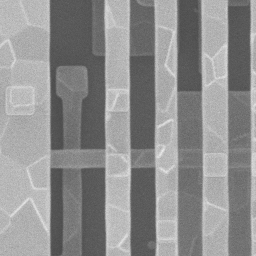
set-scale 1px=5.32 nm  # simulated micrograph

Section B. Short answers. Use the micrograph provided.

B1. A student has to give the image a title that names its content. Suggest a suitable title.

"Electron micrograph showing wiring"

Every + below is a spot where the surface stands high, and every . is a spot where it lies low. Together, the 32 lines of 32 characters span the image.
++++++.......+++..++++...+++...+
++++++.......+++...+++...+++...+
++++++.......+++...+++...+++...+
++++++.......+++...+++...+++...+
++++++.......+++....++...+++...+
++++++.......+++...+++...+++...+
++++++.......+++...+++...+++...+
++++++.......+++...+++...+++...+
++++++.......+++...+++...+++...+
++++++.......+++...+++...+++...+
++++++.......+++....++...+++...+
++++++.......+++....++...+++...+
++++++.......+++....++...+++...+
++++++.......+++....++...+++...+
++++++.......+++....++...+++...+
++++++.......+++....++...+++...+
++++++.......+++...+++...+++...+
++++++.......+++...+++...+++...+
++++++.......++++..+++...++++..+
++++++++++++++++++++++++++++++++
++++++++++++++++++++++++++++++++
++++++.......+++....++...+++...+
++++++.......+++....++...+++...+
++++++.......+++....++...+++...+
++++++.......+++....++...+++...+
++++++.......+++....++...+++...+
++++++.......+++....++...+++...+
++++++.......+++....++...+++...+
++++++.......+++....++...+++...+
++++++.......+++....++...+++...+
++++++.......+++....++...+++....
++++++.......+++....++...+++....